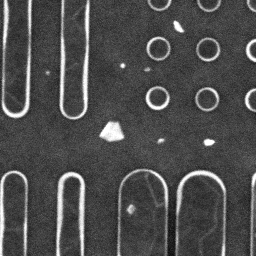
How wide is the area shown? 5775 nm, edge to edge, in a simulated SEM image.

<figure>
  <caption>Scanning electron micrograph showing groups of lines, slits or small figures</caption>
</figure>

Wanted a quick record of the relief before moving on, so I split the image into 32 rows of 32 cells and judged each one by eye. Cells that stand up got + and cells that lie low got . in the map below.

.+++....+++........++....++....+
.+++....+++.....................
.+++....+++.....................
.+++....+++.....................
.+++....+++.....................
.+++....+++........++....++....+
.+++....+++........++....++....+
.+++....+++.....................
++++....+++.....................
++++....+++.....................
+++.....+++.....................
+++.....+++........++....++....+
+++.....+++.......+++....++....+
.++.....+++........+.....++....+
........++......................
................................
.............++.................
................................
................................
................................
................................
.................++.............
+++.....++.....+++++...++++.....
+++.....++.....++++++.++++++....
+++.....++.....++++++.++++++....
+++.....++.....++++++.++++++....
+++.....++.....++++++.++++++....
+++.....++.....++++++.++++++....
+++....+++.....++++++.++++++....
+++....+++.....++++++.++++++....
+++....+++.....++++++.++++++....
+++....+++.....++++++.++++++...+